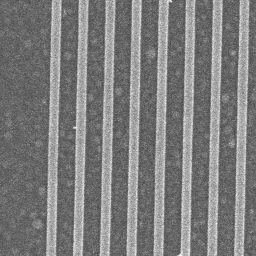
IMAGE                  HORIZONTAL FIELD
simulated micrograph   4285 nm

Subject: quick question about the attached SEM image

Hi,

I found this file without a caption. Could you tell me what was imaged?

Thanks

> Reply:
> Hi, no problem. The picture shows parallel lines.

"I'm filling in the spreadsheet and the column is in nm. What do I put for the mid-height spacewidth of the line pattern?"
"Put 306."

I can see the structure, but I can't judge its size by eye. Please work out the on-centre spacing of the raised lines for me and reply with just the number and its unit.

450 nm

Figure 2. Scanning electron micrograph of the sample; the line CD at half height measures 8.75 px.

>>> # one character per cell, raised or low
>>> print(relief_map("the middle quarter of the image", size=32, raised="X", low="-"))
----X-----XX-----XX-----X-----XX
---XX-----XX-----XX-----X-----XX
---XX-----XX-----XX-----X-----XX
---XX-----XX-----XX----XX-----XX
---XX-----XX-----XX----XX-----XX
---XX-----XX-----XX----XX-----XX
---XX-----XX-----XX----XX-----XX
---XX-----XX-----XX----XX-----XX
---XX-----XX-----XX----XX-----XX
---XX-----XX-----XX----XX-----XX
---XX-----XX-----XX----XX-----XX
---XX-----XX-----XX----XX-----XX
---XX-----XX-----XX----XX-----XX
---XX-----XX-----XX----XX-----XX
---XX-----XX----XXX----XX-----XX
---XX-----XX----XXX----XX-----XX
---XX-----XX----XXX----XX-----XX
---XX-----XX----XXX----XX-----XX
---XX-----XX----XXX----XX-----XX
---XX-----XX----XXX----XX-----XX
---XX-----XX----XXX----XX-----XX
---XX-----XX----XXX----XX-----XX
---XX-----XX----XX-----XX-----XX
---XX-----XX-----X-----XX-----XX
---XX-----XX----XX-----XX-----XX
---XX-----XX----XX-----XX-----XX
---XX-----XX----XX-----XX-----XX
---XX-----XX----XX-----XX-----XX
---XX----XXX----XX-----XX-----XX
---XX-----XX----XX-----XX-----XX
---XX-----XX----XX-----XX-----XX
---XX-----XX----XX-----XX-----XX